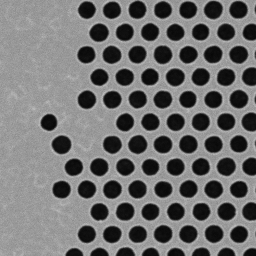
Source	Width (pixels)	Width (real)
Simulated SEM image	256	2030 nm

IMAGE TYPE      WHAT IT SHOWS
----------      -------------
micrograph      a regular array of holes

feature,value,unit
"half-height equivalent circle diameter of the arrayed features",145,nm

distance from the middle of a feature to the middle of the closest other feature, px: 25.1